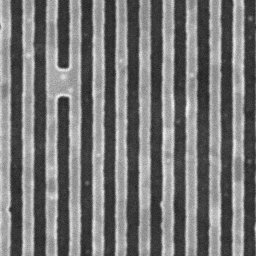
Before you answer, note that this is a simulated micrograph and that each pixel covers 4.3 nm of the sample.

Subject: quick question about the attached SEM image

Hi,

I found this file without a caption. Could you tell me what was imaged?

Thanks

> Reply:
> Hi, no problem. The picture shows parallel lines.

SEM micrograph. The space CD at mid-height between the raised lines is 0.0576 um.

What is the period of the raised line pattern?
100 nm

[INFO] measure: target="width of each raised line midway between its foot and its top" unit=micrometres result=0.042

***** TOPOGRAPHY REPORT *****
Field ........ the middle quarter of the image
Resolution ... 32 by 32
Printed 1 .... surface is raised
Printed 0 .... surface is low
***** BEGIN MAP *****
00110001110001110001100001100001
11110000110001110001100001100001
11110000110001110001100001100001
11110000110001110001110001100001
11110001110001110001110001100001
11110001110001110001110001100001
11110001110001110001110001100001
11110001110001110001110001100001
00110000110001110001110001100001
00110000110001110001110001100001
00110000110001100001100001100001
00110000110001110001100001100001
00110000110001100001100001100001
00110000110001110001100001100001
00110000110001110001100001100001
00110000110001110001100001100001
00110000110001110001100001100001
00110000110001110001100001100001
00110000110001110001100001100001
00110000110001100001100001100001
00110000110001100001100001100001
00110000110001100001100001100001
00110001110001100001100001100001
00110001110001100001100001100001
00110001110001100001100001100001
00110000110001110001100001100001
00110000110001100001100001100001
00110000110001100001100001100001
00110000110001100001100001100001
00110000110001100001100001100001
00110000110001100001100001100001
00110000110001100001100001100001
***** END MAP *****